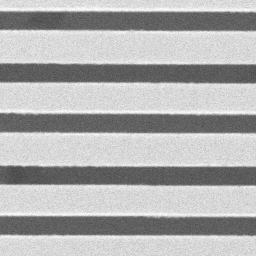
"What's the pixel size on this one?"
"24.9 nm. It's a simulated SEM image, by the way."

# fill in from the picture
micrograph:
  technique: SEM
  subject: lines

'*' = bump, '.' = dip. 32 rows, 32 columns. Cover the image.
********************************
................................
................................
................................
********************************
********************************
********************************
********************************
................................
................................
*************************.......
********************************
********************************
********************************
................................
................................
................................
********************************
********************************
********************************
********************************
................................
................................
********************************
********************************
********************************
********************************
................................
................................
................................
********************************
********************************